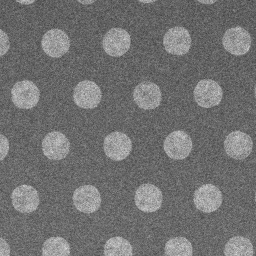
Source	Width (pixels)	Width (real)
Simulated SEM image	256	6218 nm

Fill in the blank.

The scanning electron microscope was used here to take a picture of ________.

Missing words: a regular array of raised bodies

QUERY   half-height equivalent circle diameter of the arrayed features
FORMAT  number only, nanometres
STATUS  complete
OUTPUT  660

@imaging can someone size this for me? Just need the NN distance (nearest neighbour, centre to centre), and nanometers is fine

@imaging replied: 862